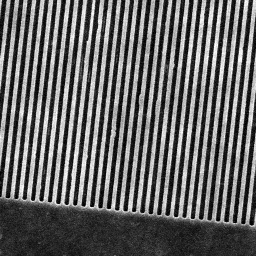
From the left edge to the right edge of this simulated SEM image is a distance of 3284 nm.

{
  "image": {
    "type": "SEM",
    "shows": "parallel lines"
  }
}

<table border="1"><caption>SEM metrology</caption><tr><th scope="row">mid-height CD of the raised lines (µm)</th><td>0.0447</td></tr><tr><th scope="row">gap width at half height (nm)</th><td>55.8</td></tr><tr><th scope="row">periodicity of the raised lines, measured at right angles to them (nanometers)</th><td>108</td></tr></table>